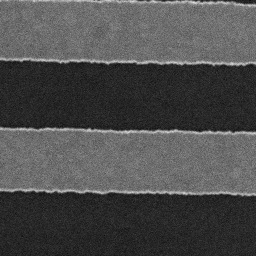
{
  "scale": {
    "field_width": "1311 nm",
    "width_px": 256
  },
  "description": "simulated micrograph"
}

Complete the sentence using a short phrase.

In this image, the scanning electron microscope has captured one or a few lines or trenches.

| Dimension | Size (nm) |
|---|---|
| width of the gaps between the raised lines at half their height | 353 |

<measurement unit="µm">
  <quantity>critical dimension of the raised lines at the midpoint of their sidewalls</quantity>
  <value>0.314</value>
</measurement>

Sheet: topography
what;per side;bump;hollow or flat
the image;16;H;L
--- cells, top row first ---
HHHHHHHHHHHHHHHH
HHHHHHHHHHHHHHHH
HHHHHHHHHHHHHHHH
HHHHHHHHHHHHHHHH
LLLLLLLLLLLLLLLL
LLLLLLLLLLLLLLLL
LLLLLLLLLLLLLLLL
LLLLLLLLLLLLLLLL
HHHHHHHHHHHHHHHH
HHHHHHHHHHHHHHHH
HHHHHHHHHHHHHHHH
HHHHHHHHHHHHHHHH
LLLLLLLLLLLLLLLL
LLLLLLLLLLLLLLLL
LLLLLLLLLLLLLLLL
LLLLLLLLLLLLLLLL